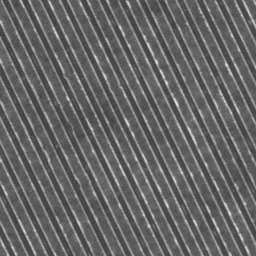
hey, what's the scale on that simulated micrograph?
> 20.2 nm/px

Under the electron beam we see parallel lines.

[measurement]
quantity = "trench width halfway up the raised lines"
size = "125 nm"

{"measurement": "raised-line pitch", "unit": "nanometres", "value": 354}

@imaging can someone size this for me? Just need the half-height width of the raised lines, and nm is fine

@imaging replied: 230